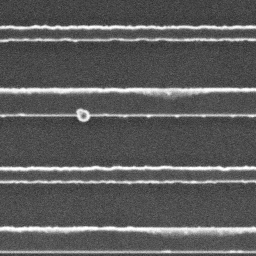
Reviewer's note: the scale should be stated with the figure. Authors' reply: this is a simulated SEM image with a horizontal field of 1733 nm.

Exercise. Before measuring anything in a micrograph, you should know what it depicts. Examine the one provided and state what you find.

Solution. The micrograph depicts lines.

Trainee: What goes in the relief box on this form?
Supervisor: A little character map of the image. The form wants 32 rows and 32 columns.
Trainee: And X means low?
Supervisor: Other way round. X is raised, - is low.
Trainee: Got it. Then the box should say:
--------------------------------
--------------------------------
--------------------------------
XXXXXXXXXXXXXXXXXXXXXXXXXXXXXXXX
XXXXXXXXXXXXXXXXXXXXXXXXXXXXXXXX
--------------------------------
--------------------------------
--------------------------------
--------------------------------
--------------------------------
--------------------------------
XXXXXXXXXXXXXXXXXXXXXXXXXXXXXXXX
XXXXXXXXXXXXXXXXXXXXXXXXXXXXXXXX
XXXXXXXXXXXXXXXXXXXXXXXXXXXXXXXX
X--------XXX---X--X---X--X---X-X
--------------------------------
--------------------------------
--------------------------------
--------------------------------
--------------------------------
--------------------------------
XXXXXXXXXXXXXXXXXXXXXXXXXXXXXXXX
XXXXXXXXXXXXXXXXXXXXXXXXXXXXXXXX
--------------------------------
--------------------------------
--------------------------------
--------------------------------
--------------------------------
--------------------------------
XXXXXXXXXXXXXXXXXXXXXXXXXXXXXXXX
XXXXXXXXXXXXXXXXXXXXXXXXXXXXXXXX
XXXXXXXXXXXXXXXXXXXXXXXXXXXXXXXX